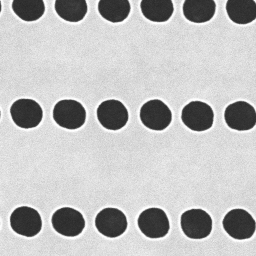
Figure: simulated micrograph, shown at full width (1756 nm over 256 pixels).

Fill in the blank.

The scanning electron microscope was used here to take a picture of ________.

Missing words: a regular array of holes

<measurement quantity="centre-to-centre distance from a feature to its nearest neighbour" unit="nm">291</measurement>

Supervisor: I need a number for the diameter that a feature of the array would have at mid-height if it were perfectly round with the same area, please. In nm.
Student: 219